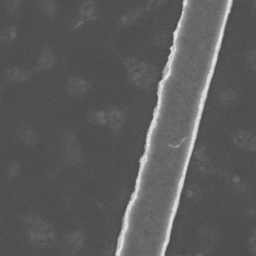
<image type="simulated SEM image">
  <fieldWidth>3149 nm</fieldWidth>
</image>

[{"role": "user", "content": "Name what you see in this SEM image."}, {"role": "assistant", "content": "one or a few lines or trenches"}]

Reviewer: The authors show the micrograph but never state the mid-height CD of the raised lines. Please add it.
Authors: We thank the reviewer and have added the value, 0.54 um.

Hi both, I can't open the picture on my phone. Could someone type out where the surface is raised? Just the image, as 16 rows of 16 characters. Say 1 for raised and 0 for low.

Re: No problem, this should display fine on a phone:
0000000000011100
0000000000011100
0000000000011100
0000000000011000
0000000000111000
0000000000111000
0000000000111000
0000000000110000
0000000001110000
0000000001110000
0000000001110000
0000000001100000
0000000011100000
0000000011100000
0000000011100000
0000000111000000